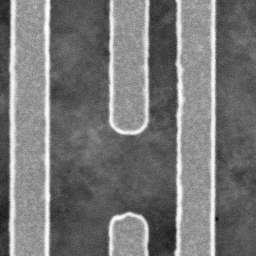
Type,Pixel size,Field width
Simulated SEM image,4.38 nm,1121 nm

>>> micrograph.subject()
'one or a few lines or trenches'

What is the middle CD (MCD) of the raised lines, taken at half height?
0.157 micrometres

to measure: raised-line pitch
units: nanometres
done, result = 364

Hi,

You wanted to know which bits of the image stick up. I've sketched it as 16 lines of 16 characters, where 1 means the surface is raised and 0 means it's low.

0110000110011000
0110000110011000
0110000110011000
0110000110011000
0110000110011000
0110000110011000
0110000110011000
0110000110011000
0110000000011000
0110000000011000
0110000000011000
0110000000011000
0110000000011000
0110000010011000
0110000110011000
0110000110011000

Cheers